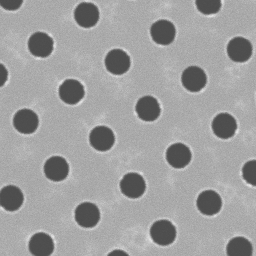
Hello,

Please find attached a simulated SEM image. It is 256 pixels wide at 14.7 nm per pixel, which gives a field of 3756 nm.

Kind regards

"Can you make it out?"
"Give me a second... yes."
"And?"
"a regular array of holes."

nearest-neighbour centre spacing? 54.4 pixels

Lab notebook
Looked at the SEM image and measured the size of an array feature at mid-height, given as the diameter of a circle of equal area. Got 392 nm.